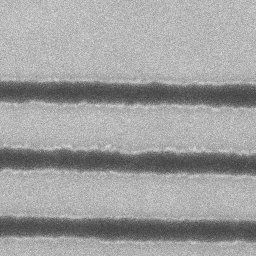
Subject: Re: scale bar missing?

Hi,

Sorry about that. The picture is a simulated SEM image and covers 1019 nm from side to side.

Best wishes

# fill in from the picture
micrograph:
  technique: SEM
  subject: one or a few lines or trenches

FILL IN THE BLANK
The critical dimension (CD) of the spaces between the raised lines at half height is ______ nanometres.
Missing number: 171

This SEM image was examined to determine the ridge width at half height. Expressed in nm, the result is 99.6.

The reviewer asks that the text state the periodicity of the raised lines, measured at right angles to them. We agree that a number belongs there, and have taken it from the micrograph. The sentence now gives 270 nm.